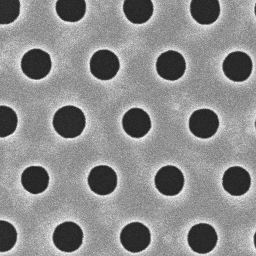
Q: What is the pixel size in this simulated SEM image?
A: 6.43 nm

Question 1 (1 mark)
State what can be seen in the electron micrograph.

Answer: a regular array of holes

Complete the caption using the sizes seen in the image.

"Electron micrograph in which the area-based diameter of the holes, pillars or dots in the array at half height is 198 nanometres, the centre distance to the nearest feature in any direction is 0.425 um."